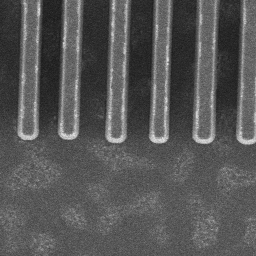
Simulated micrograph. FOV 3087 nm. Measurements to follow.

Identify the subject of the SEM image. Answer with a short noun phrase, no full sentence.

parallel lines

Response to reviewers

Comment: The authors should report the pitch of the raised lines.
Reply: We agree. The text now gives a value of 530 nm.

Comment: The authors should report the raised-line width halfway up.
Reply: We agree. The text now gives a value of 0.217 um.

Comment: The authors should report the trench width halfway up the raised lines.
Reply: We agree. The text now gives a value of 319 nm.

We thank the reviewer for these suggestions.